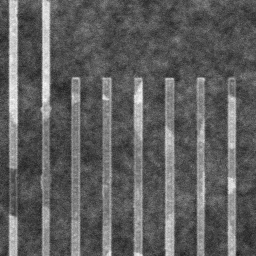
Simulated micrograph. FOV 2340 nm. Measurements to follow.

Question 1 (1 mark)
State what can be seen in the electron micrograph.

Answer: parallel lines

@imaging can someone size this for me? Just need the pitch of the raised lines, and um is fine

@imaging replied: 0.289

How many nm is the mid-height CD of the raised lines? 62.8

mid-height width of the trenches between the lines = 219 nanometres